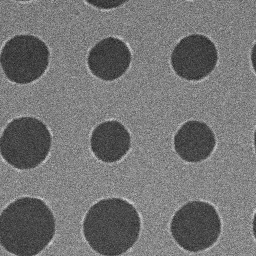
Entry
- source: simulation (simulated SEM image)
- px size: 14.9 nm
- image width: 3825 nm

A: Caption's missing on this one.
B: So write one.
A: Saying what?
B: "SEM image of holes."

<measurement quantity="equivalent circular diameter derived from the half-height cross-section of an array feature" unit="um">0.659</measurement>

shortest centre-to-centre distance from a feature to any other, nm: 1260